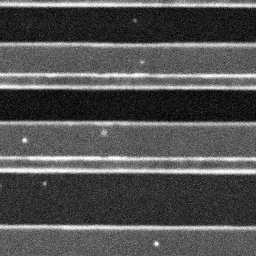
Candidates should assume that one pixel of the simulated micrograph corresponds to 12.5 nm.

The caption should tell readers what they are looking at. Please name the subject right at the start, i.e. lines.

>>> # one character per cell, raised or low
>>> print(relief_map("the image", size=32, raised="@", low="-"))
@@@@@@@@@@@@@@@@@@@@@@@@@@@@@@@@
--------------------------------
--------------------------------
--------------------------------
--------------------------------
--------------------------------
@@@@@@@@@@@@@@@@@@@@@@@@@@@@@@@@
@@@@@@@@@@@@@@@@@@@@@@@@@@@@@@@@
@@@@@@@@@@@@@@@@@@@@@@@@@@@@@@@@
@@@@@@@@@@@@@@@@@@@@@@@@@@@@@@@@
@@@@@@@@@@@@@@@@@@@@@@@@@@@@@@@@
--------------------------------
--------------------------------
--------------------------------
--------------------------------
@@@@@@@@@@@@@@@@@@@@@@@@@@@@@@@@
@@@@@@@@@@@@@@@@@@@@@@@@@@@@@@@@
@@@@@@@@@@@@@@@@@@@@@@@@@@@@@@@@
@@@@@@@@@@@@@@@@@@@@@@@@@@@@@@@@
@@@@@@@@@@@@@@@@@@@@@@@@@@@@@@@@
@@@@@@@@@@@@@@@@@@@@@@@@@@@@@@@@
--------------------------------
--------------------------------
--------------------------------
--------------------------------
--------------------------------
--------------------------------
--------------------------------
@@@@@@@@@--@@-------------------
@@@@@@@@@@@@@@@@@@@@@@@@@@@@@@@@
@@@@@@@@@@@@@@@@@@@@@@@@@@@@@@@@
@@@@@@@@@@@@@@@@@@@@@@@@@@@@@@@@